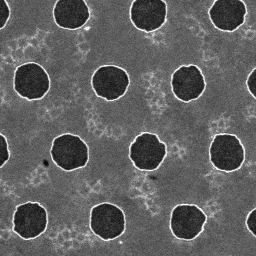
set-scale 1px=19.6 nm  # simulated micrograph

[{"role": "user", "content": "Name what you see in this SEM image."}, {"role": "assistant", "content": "a regular array of raised bodies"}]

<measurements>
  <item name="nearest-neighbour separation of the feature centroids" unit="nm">1520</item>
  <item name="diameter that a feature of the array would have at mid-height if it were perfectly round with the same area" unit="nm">718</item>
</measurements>